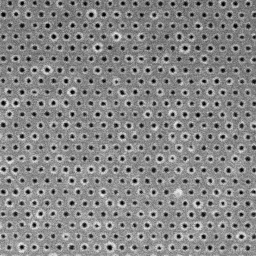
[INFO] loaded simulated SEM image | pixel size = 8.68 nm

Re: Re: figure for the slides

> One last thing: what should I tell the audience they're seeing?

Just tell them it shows a regular array of holes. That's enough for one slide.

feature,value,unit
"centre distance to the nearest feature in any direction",106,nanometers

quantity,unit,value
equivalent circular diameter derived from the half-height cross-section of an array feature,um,0.048